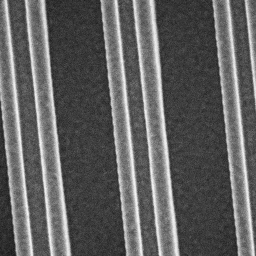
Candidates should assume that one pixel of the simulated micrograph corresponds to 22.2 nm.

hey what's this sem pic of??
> lines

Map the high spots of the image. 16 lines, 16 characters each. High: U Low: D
UUUDDDUUUDDDDUUU
UUUDDDUUUUDDDUUU
UUUDDDDUUUDDDDUU
UUUDDDDUUUDDDDUU
UUUDDDDUUUDDDDUU
UUUDDDDUUUDDDDUU
UUUDDDDUUUDDDDUU
UUUDDDDUUUDDDDUU
UUUDDDDUUUDDDDUU
UUUUDDDUUUDDDDUU
UUUUDDDUUUDDDDUU
DUUUDDDUUUUDDDUU
DUUUDDDDUUUDDDDU
DUUUDDDDUUUDDDDU
DUUUDDDDUUUDDDDU
DUUUDDDDUUUDDDDU